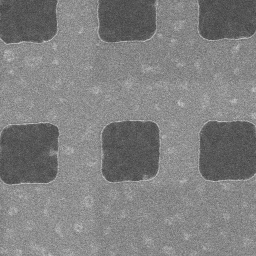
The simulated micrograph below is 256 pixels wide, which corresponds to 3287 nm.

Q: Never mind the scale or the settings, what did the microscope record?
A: raised bodies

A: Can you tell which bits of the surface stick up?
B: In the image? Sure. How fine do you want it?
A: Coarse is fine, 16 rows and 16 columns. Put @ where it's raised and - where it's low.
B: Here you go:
@@@@--@@@@--@@@@
@@@@--@@@@--@@@@
@@@----@@-------
----------------
----------------
----------------
----------------
----------------
@@@@--@@@@--@@@@
@@@---@@@@--@@@@
@@@@--@@@@--@@@@
----------------
----------------
----------------
----------------
----------------